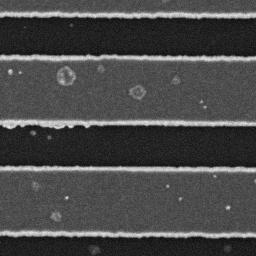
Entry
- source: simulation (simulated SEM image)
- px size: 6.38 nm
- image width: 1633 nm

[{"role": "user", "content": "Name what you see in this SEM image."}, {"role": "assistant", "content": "lines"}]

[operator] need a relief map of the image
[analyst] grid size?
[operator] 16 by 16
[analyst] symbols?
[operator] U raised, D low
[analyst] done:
UUUUUUUUUUUUUUUU
DDDDDDDDDDDDDDDD
DDDDDDDDDDDDDDDD
DDDDDDDDDDDDDDDD
UUUUUUUUUUUUUUUU
UUUUUUUUUUUUUUUU
UUUUUUUUUUUUUUUU
UUUUUUUUUUUUUUUU
DDDDDDDDDDDDDDDD
DDDDDDDDDDDDDDDD
UDDDDDDDDDDDDDDD
UUUUUUUUUUUUUUUU
UUUUUUUUUUUUUUUU
UUUUUUUUUUUUUUUU
UUUUUUUUUUUUUUUU
DDDDDDDDDDDDDDDD